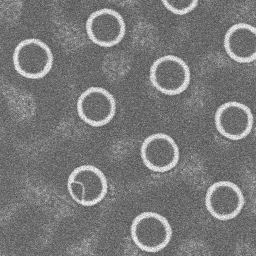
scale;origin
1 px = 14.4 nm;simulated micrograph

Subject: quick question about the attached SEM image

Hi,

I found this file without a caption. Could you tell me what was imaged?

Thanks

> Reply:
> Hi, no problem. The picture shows a regular array of raised bodies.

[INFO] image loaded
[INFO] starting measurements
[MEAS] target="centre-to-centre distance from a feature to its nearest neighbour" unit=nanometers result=1120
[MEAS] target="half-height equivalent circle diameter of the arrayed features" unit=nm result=497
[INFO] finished